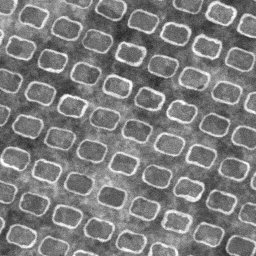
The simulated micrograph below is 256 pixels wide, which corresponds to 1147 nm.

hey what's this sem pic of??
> a regular array of raised bodies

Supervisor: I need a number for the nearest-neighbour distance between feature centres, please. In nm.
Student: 153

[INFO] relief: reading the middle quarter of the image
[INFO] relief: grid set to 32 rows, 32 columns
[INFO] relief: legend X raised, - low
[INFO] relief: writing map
---XXXX--------------XXXXXXX----
--XXXXXXX------------XXXXXXX--XX
--XXXXXXX-------------XXXXX--XXX
--XXXXXXX--XXXX--------------XXX
---XXXXX--XXXXXXX------------XXX
----------XXXXXXX-------------XX
----------XXXXXXX--XXX----------
-----------XXXXX--XXXXXX--------
XXXX----------X---XXXXXXX-------
XXXXXX------------XXXXXXX--XX---
XXXXXX-------------XXXXX--XXXXXX
XXXXX---XXX-----------X---XXXXXX
XXXXX--XXXXXXX------------XXXXXX
------XXXXXXXX------------XXXXXX
-------XXXXXXX--XXX-----------X-
--------XXXXX--XXXXXX-----------
---------------XXXXXXX----------
XX-------------XXXXXXX---XX-----
XXX-------------XXXXX--XXXXXX---
XX---XXX-----------X---XXXXXXX--
XX--XXXXXX-------------XXXXXXX--
----XXXXXXX------------XXXXXX--X
---XXXXXXX---XX-----------XXX--X
-----XXXXX--XXXXXX-------------X
-------XX---XXXXXXX------------X
-----------XXXXXXX---XX---------
------------XXXXXX--XXXXXX------
-XXX-----------XX---XXXXXXX-----
-XXXXXX-------------XXXXXXX---X-
XXXXXXXX------------XXXXXX---XXX
XXXXXXX---XX----------XXXX--XXXX
-XXXXXX--XXXXXX------------XXXXX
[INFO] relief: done